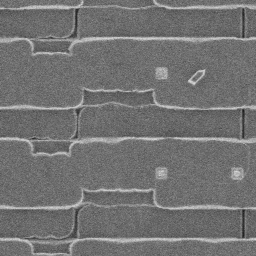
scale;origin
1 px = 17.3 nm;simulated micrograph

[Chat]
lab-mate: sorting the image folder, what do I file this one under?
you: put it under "wiring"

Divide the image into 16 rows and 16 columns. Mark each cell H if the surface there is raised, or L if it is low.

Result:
HHLLLLLLLLLLLLLL
LLLLLLLLLLLLLLLL
LHLLLHHHHHHHHHHH
HHHHHHHHHHHHHHHH
HHHHHHHHHHHHHHHH
HHHHHHHHHHHHHHHH
HHHHHLLLLLHHHHHH
LLLLLLLLLLLLLLLL
LLLLLLLLLLLLLLLL
HHLLHHHHHHHHHHHH
HHHHHHHHHHHHHHHH
HHHHHHHHHHHHHHHH
HHHHHLLLLLHHHHHH
LLLLLLLLLLLLLLLL
LLLLLLLLLLLLLLLL
HHLLHHHHHHHHHHHH